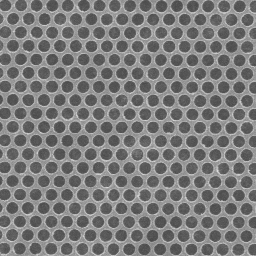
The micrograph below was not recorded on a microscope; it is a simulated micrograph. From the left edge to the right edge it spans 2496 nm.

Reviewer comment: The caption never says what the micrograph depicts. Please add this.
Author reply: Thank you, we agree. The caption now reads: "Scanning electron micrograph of a regular array of holes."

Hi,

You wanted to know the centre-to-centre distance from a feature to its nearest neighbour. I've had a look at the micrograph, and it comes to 150 nm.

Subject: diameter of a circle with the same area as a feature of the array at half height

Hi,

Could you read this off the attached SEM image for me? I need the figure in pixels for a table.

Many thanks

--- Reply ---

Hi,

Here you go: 12.1